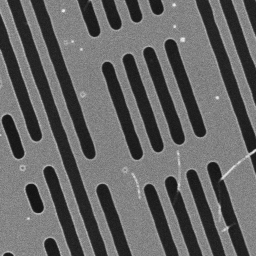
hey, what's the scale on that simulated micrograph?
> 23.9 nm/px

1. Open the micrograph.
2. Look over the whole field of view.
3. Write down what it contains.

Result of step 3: groups of lines, slits or small figures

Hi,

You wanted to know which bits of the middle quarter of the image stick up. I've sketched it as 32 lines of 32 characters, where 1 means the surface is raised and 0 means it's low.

01111111100011100011100011100011
01111111100001100011100001100011
01111111110001110001100001110001
00111111110001110001110001110001
00111111111000110001110001110001
00111111111000110000111000111000
00011111111000111000111000111000
00011111111000011000011000011000
00011111111100011100011100011000
00001111111100001100011100011100
10001111111110001100001100001100
10001111111110001110001110001110
10000111111110001110001110001110
11000111111111000110000110000110
11000111111111000111000111000110
11100011111111000111000111000111
11100011111111100011000011000011
01100011111111100011100011100011
01100001111111100011100011100011
01110001111111110001100001100011
00110001111111110001110001111111
00110000111111110000110001111111
00111000111111111000111111111111
00011101111111111001111111111111
00011111111111111111111111111111
00011111111111111111111111111111
00001111111111111111111111111110
10001111111111111111111111111100
10001111111111111111111111001110
11000111111111111111111110001110
11000111000111111111001110000110
11000111000111111111000111001111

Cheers